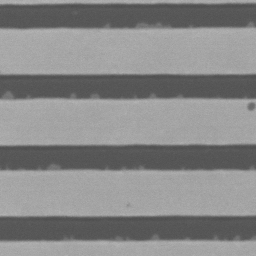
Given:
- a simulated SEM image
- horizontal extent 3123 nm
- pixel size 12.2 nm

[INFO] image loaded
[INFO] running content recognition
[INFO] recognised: lines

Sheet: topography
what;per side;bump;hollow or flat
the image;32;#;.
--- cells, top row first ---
................................
................................
................................
.......#................########
################################
################################
################################
################################
################################
................................
................................
................................
#.##############################
################################
################################
################################
################################
################################
................................
................................
................................
################################
################################
################################
################################
################################
################################
................................
................................
................................
################################
################################